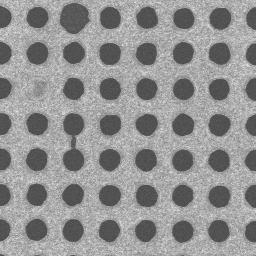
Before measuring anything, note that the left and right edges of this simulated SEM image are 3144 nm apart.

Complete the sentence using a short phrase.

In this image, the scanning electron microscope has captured a regular array of holes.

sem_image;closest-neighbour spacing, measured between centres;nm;434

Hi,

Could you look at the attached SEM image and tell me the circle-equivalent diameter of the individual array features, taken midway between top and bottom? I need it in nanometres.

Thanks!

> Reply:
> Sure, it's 269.